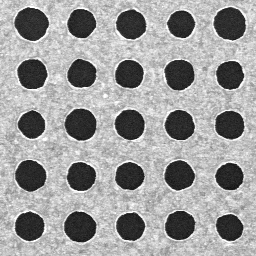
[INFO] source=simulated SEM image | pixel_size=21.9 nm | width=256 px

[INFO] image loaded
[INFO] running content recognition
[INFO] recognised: a regular array of holes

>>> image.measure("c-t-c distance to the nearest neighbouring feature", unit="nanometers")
1080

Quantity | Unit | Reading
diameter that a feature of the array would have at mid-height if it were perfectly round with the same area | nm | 664